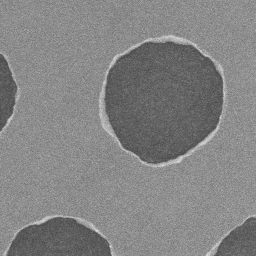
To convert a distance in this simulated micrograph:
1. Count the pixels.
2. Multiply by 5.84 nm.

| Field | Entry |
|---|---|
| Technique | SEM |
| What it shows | holes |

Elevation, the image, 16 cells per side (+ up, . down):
++++++++++++++++
++++++++++++++++
++++++++++.+++++
++++++++.....+++
.++++++.......++
.++++++.......++
.+++++........++
.+++++........++
+++++++......+++
++++++++....++++
++++++++++++++++
++++++++++++++++
++++++++++++++++
++++++++++++++++
+.....++++++++..
+......++++++...